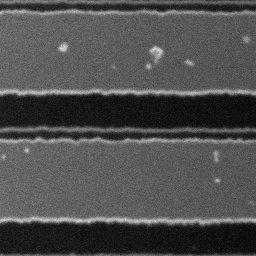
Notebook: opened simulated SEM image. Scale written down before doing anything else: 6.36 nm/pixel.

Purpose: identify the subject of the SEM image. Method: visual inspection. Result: lines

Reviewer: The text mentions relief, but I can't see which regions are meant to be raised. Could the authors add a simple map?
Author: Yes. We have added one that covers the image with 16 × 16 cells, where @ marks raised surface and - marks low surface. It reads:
----------------
@@@@@@@@@@@@@@@@
@@@@@@@@@@@@@@@@
@@@@@@@@@@@@@@@@
@@@@@@@@@@@@@@@@
@@@@@@@@@@@@@@@@
----------------
----------------
----------------
@@@@@@@@@@@@@@@@
@@@@@@@@@@@@@@@@
@@@@@@@@@@@@@@@@
@@@@@@@@@@@@@@@@
@@@@@@@@@@@@@@@@
----------------
----------------